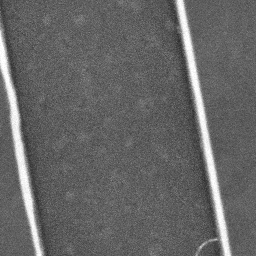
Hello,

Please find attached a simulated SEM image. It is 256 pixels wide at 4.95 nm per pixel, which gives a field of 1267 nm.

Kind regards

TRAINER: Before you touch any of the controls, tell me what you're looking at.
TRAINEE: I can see one or a few lines or trenches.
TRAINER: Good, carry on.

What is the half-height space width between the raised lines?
915 nanometers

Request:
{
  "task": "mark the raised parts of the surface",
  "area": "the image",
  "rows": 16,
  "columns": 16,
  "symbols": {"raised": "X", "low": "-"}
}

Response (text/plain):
-----------XXXXX
-----------XXXXX
------------XXXX
------------XXXX
------------XXXX
X-----------XXXX
X-----------XXXX
X------------XXX
X------------XXX
X------------XXX
X------------XXX
XX-----------XXX
XX------------XX
XX------------XX
XX------------XX
XX------------XX